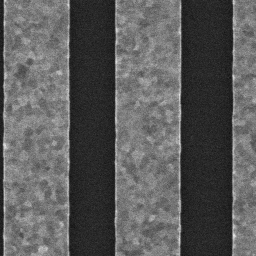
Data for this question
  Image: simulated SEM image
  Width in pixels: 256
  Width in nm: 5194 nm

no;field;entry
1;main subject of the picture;wiring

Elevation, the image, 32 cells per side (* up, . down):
.********......********......***
.********......********......***
.********......********......***
.********......********......***
.********......********......***
.********......********......***
*********.....*********......***
*********......********......***
.********......********......***
.********......********......***
*********......********......***
.********......********......***
.********......*******.......***
.********......********......***
*********......********......***
.********......********......***
.********......*******.......***
*********......*******.......***
*********......********......***
*********......*******.......***
.********.....********.......***
.********......*******.......***
********.......*******.......***
********.......*******.......***
.*******.......*******.......***
.********......********......***
.********......********......***
.*******......********.......***
.*******......*********......***
********.......*******.......***
.*******.......*******.......***
*********......*******.......***